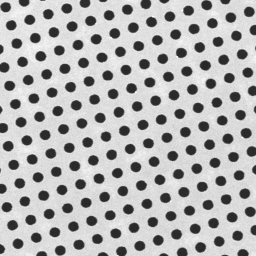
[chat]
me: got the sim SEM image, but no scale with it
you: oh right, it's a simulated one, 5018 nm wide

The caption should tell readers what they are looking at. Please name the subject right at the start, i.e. a regular array of holes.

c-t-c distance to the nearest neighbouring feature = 372 nm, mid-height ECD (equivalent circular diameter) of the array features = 0.209 um